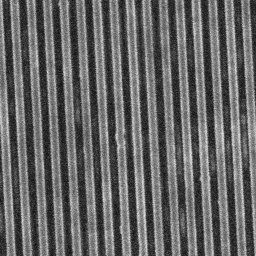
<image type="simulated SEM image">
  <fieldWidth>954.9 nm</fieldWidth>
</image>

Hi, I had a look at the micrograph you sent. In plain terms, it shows parallel lines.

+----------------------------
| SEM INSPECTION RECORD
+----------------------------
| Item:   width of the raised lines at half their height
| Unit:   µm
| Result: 0.0261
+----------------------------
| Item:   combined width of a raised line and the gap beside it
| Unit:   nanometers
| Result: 61.5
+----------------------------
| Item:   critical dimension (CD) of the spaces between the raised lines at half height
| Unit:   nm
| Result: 33.6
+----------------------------